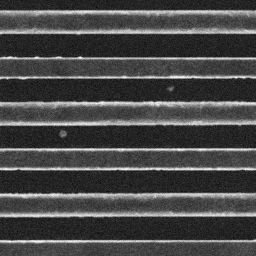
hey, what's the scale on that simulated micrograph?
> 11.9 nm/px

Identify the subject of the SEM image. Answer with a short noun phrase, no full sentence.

lines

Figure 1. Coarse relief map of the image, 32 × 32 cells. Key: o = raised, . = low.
................................
.........ooooooo......ooooo.....
oooooooooooooooooooooooooooooooo
oooooooooooooooooooooooooooooooo
................................
................................
................................
oooooooooooooooooooooooooooooooo
oooooooooooooooooooooooooooooooo
oooooooooooooooooooooooooooooooo
................................
................................
................................
oooooooooooooooooooooooooooooooo
oooooooooooooooooooooooooooooooo
...ooooooooo....................
................................
................................
................................
oooooooooooooooooooooooooooooooo
oooooooooooooooooooooooooooooooo
................................
................................
................................
oooooooooooooooooooooooooooooooo
oooooooooooooooooooooooooooooooo
oooooooooooooooooooooooooooooooo
................................
................................
................................
oooooooooooooooooooooooooooooooo
oooooooooooooooooooooooooooooooo